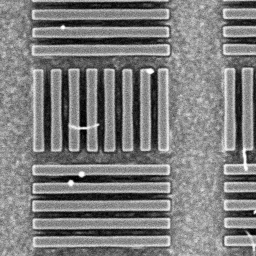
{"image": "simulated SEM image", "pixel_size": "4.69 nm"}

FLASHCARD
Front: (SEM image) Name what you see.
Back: groups of lines, slits or small figures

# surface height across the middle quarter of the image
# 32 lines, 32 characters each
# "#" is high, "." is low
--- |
................................
.###..##..##...##..###..##......
.###..##..##...##..###..##......
.###..##..##...##..##...##......
.###..##..##...##..##...##......
.###..##..##...##..##...##......
..##..##..##...##..##...##......
..##..##..##...##..##...##......
..##..##..##...##..##...##......
..##..##..##...##..###..##......
..##..##..##...##..###..##......
..##..##..##...##..###..##......
..##..##..###..##..###..##......
..##..##..###..##..###..##......
.###..##..###..##..###..##......
.###..##..###..##..###..##......
.###..##..###..##..###..##......
.###..##..###..##..###..##......
.###..##..###..##..###..##......
.###..##..###..##..###..##......
.###..##..###..##..##...##......
..##..##..###..##..##...##......
................................
................................
................................
##########################......
##########################......
##########################......
................................
.#..............................
##########################......
##########################......